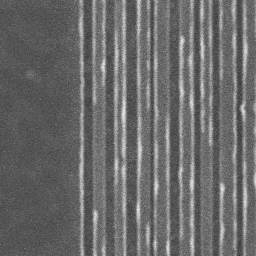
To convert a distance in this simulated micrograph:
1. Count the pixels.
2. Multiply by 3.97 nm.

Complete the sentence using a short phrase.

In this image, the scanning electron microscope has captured parallel lines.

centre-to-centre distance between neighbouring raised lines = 21.5 px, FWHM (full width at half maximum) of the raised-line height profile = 48.7 nanometers